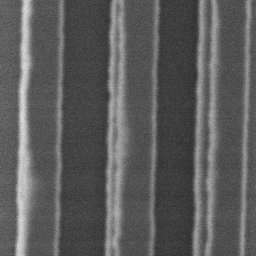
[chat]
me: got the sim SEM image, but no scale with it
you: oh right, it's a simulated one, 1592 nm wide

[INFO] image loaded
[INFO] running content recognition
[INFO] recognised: lines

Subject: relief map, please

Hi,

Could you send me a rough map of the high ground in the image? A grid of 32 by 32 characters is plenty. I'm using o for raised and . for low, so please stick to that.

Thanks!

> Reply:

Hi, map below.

...ooooo......oooooo.....oooooo.
...ooooo......oooooo.....oooooo.
...ooooo......oooooo.....oooooo.
...ooooo......oooooo.....oooooo.
...ooooo......oooooo.....oooooo.
...ooooo......oooooo.....oooooo.
...ooooo......oooooo.....oooooo.
...ooooo......ooooo......oooooo.
...ooooo......ooooo......oooooo.
...ooooo......ooooo......oooooo.
...ooooo......ooooo......oooooo.
...ooooo......ooooo......oooooo.
...oooo.......ooooo......oooooo.
...oooo.......ooooo......oooooo.
...oooo.......ooooo......oooooo.
...oooo.......ooooo......oooooo.
...oooo.......ooooo......oooooo.
...oooo.......ooooo......oooooo.
...oooo.......ooooo......oooooo.
..ooooo.......ooooo.....ooooooo.
..ooooo.......ooooo.....ooooooo.
..ooooo.......ooooo.....ooooooo.
..ooooo.......ooooo.....ooooooo.
..ooooo.......ooooo.....ooooooo.
..ooooo.......ooooo.....oooooo..
..ooooo......oooooo......oooooo.
..ooooo.......ooooo.....oooooo..
..ooooo......oooooo.....oooooo..
..ooooo......oooooo.....oooooo..
..ooooo......oooooo.....oooooo..
..ooooo......oooooo.....oooooo..
..ooooo......oooooo.....oooooo..